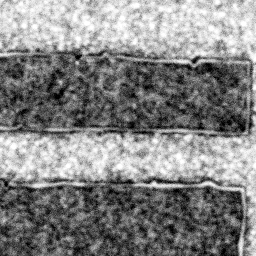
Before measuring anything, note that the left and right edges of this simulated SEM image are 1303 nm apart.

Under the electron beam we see one or a few lines or trenches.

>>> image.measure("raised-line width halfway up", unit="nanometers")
371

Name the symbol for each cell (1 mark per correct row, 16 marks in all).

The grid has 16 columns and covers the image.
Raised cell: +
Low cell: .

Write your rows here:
................
................
................
++++..+.........
++++++++++++++++
++++++++++++++++
++++++++++++++++
++++++++++++++++
................
................
................
...+++..........
+++++++++++++++.
+++++++++++++++.
+++++++++++++++.
+++++++++++++++.